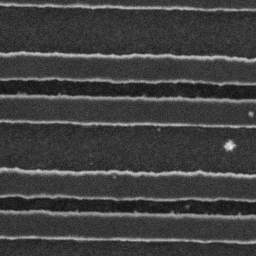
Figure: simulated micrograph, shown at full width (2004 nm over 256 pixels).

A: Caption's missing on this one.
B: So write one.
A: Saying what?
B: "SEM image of lines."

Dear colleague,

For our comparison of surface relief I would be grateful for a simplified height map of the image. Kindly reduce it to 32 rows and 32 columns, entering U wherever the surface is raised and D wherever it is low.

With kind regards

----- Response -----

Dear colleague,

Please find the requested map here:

UUUUUUUUUUUUUUUUUUUUUUUUUUUUUUUU
DDDDDDDDDDDDDDDDDDDDDDDDDDDDDDDD
DDDDDDDDDDDDDDDDDDDDDDDDDDDDDDDD
DDDDDDDDDDDDDDDDDDDDDDDDDDDDDDDD
DDDDDDDDDDDDDDDDDDDDDDDDDDDDDDDD
DDDDDDDDDDDDDDDDDDDDDDDDDDDDDDDD
DDDDDDDDDDDDDDDDDDDDDDDDDDDDDDDD
UUUUUUUUUUUUUUUUUUUUUUUUUUUUUUUU
UUUUUUUUUUUUUUUUUUUUUUUUUUUUUUUU
UUUUUUUUUUUUUUUUUUUUUUUUUUUUUUUU
DDDDDDDDDDDDDDDDDDDDDDDDDDDUDUUU
DDDDDDDDDDDDDDDDDDDDDDDDDDDDDDDD
UUUUUUUUUUUUUUUUUUUUUUUUUUUUUDUU
UUUUUUUUUUUUUUUUUUUUUUUUUUUUUUUU
UUUUUUUUUUUUUUUUUUUUUUUUUUUUUUUU
DDDDDDDDDDUUUUUUUUUUUUUUUUUUUUUU
DDDDDDDDDDDDDDDDDDDDDDDDDDDDDDDD
DDDDDDDDDDDDDDDDDDDDDDDDDDDDDDDD
DDDDDDDDDDDDDDDDDDDDDDDDDDDDDDDD
DDDDDDDDDDDDDDDDDDDDDDDDDDDDDDDD
DDDDDDDDDDDDDDDDDDDDDDDDDDDDDDDD
UUUUUUUUDUUUUUUUDDDDDDDDDDDDDDDD
UUUUUUUUUUUUUUUUUUUUUUUUUUUUUUUU
UUUUUUUUUUUUUUUUUUUUUUUUUUUUUUUU
UUUUUUUUUUUUUUUUUUUUUUUUUUUUUUUU
DDDDDDDDDDDDDDDDDDDDDDDDDDDDDDDD
UUUUUUDDDDDDDDDDDDDDDDDDDDDDDDDD
UUUUUUUUUUUUUUUUUUUUUUUUUUUUUUUU
UUUUUUUUUUUUUUUUUUUUUUUUUUUUUUUU
UUUUUUUUUUUUUUUUUUUUUUUUUUUUUUUU
DDDDDDDDDDDDDDDDDDDDDDDDDDDDDDDD
DDDDDDDDDDDDDDDDDDDDDDDDDDDDDDDD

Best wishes